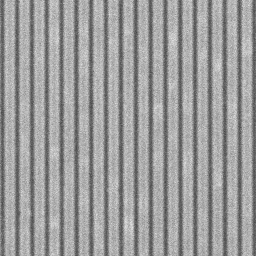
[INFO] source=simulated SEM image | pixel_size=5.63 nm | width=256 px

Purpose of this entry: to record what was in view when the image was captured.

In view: parallel lines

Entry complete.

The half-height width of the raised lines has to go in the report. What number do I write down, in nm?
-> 55.6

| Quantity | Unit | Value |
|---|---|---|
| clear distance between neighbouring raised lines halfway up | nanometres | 27.4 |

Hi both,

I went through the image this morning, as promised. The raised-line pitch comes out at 83.4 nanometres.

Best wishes